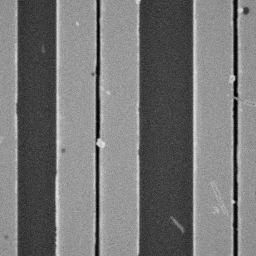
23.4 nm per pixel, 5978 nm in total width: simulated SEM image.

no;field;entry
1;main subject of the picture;lines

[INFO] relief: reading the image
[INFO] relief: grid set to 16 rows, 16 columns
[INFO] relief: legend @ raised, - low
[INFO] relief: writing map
@---@@@@@---@@@@
@---@@@@@---@@@@
@---@@@@@---@@@@
@---@@@@@---@@@@
@---@@@@@---@@@@
@---@@@@@---@@@@
@---@@@@@---@@@@
@---@@@@@---@@@@
@---@@@@@---@@@@
@---@@@@@---@@@@
@---@@@@@---@@@@
@---@@@@@---@@@@
@---@@@@@---@@@@
@---@@@@@---@@@@
@---@@@@@---@@@@
@---@@@@@---@@@@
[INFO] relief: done